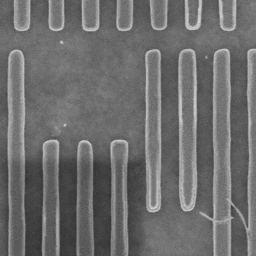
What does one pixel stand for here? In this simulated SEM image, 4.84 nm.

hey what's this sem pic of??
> wiring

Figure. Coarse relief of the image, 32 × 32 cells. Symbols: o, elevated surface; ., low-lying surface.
..oo..oo..oo...oo..oo..oo..oo...
..oo..oo..oo...oo..oo..oo..oo...
..oo..oo..oo...oo..oo..oo...o...
..o...oo..oo...o...oo..oo...o...
................................
................................
..o................o...o...oo..o
.oo...............oo..oo...oo..o
.oo...............oo..oo...oo..o
.oo...............oo..oo...oo..o
.oo...............oo..ooo..oo..o
.oo...............oo..ooo..oo..o
.oo...............oo..oo...oo..o
.oo...............oo..ooo..oo..o
.oo...............oo..ooo..oo..o
.oo...............oo..ooo..oo..o
.oo...............oo..oo...oo..o
.oo...............oo..oo...oo..o
.oo..oo...o...oo..oo..oo...oo..o
.oo..oo...oo..oo..oo..oo...oo..o
.oo..oo...oo..oo..oo..oo...oo..o
.oo..oo...oo..oo..oo..ooo..oo..o
.oo..oo...oo..oo..oo..ooo..oo..o
.oo..oo...oo..oo..oo..ooo..oo..o
.oo..oo...o...oo..oo..oo...oo..o
.oo..oo...o...oo..oo...o...oo..o
.oo..oo...oo..oo...........oo..o
.oo..oo...oo..oo...........oo..o
.oo..oo...oo..oo...........oo..o
.oo..oo...oo..oo...........oo..o
.oo..oo...oo..oo...........oo..o
.oo..oo...oo..oo...........oo..o